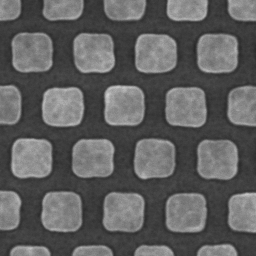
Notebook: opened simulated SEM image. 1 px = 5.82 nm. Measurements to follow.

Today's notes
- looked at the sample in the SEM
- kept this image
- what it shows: a regular array of raised bodies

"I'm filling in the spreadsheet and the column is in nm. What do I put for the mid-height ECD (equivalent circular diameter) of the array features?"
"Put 250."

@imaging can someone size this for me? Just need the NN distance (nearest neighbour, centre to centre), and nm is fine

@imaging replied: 353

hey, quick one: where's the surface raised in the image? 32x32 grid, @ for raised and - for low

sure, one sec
@@@--@@@@@---@@@@@---@@@@@---@@@
@@@--@@@@@---@@@@@---@@@@@---@@@
@-------------@@@-----@@@-----@@
--------------------------------
--@@@@----@@@@----@@@----@@@@---
--@@@@---@@@@@---@@@@@---@@@@@--
--@@@@@--@@@@@---@@@@@---@@@@@--
--@@@@@--@@@@@---@@@@@---@@@@@--
--@@@@----@@@@---@@@@@---@@@@---
--------------------------------
--------------------------------
@@----@@@@---@@@@@---@@@@----@@@
@@@--@@@@@---@@@@@---@@@@@---@@@
@@@--@@@@@---@@@@@---@@@@@---@@@
@@@--@@@@@---@@@@@---@@@@@---@@@
@@----@@@@----@@@----@@@@----@@@
--------------------------------
--@@@@----@@@-----@@@-----------
--@@@@@--@@@@@---@@@@@---@@@@@--
--@@@@---@@@@@---@@@@@---@@@@@--
--@@@@---@@@@@---@@@@@---@@@@@--
--@@@@---@@@@@---@@@@@---@@@@@--
--------------------------------
--------------------------------
@@----@@@@---@@@@@----@@@----@@@
@@@--@@@@@---@@@@@---@@@@@---@@@
@@---@@@@@---@@@@@---@@@@@---@@@
@@---@@@@@---@@@@@---@@@@@---@@@
@@----@@@@---@@@@@---@@@@----@@@
--------------------------------
--------------------------------
-@@@@@---@@@@@---@@@@@---@@@@@--